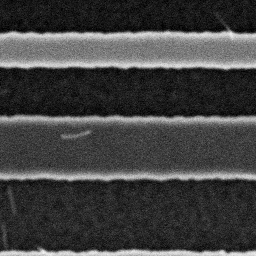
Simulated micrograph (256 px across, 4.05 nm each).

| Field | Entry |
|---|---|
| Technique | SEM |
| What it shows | lines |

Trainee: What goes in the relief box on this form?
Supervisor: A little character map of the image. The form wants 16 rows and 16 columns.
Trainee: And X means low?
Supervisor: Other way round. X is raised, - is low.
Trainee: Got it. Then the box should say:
----------------
----------------
XXXXXXXXXXXXXXXX
XXXXXXXXXXXXXXXX
----------------
----------------
----------------
XXXXXXXXXXXXXXXX
XXXXXXXXXXXXXXXX
XXXXXXXXXXXXXXXX
XXXXXXXXXXXXXXXX
----------------
----------------
----------------
----------------
----------------